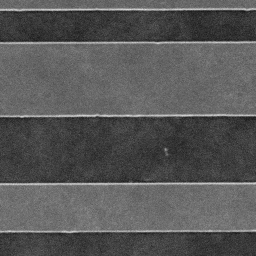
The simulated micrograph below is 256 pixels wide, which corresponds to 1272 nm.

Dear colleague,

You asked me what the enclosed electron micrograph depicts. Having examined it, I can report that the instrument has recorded one or a few lines or trenches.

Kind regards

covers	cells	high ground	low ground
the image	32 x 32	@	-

@@@@@@@@@@@@@@@@@@@@@@@@@@@@@@@@
--------------------------------
--------------------------------
--------------------------------
--------------------------------
@@@@@@@@@@@@@@@@@@@@@@@@@@@@@@@@
@@@@@@@@@@@@@@@@@@@@@@@@@@@@@@@@
@@@@@@@@@@@@@@@@@@@@@@@@@@@@@@@@
@@@@@@@@@@@@@@@@@@@@@@@@@@@@@@@@
@@@@@@@@@@@@@@@@@@@@@@@@@@@@@@@@
@@@@@@@@@@@@@@@@@@@@@@@@@@@@@@@@
@@@@@@@@@@@@@@@@@@@@@@@@@@@@@@@@
@@@@@@@@@@@@@@@@@@@@@@@@@@@@@@@@
@@@@@@@@@@@@@@@@@@@@@@@@@@@@@@@@
-@@@---@@@---@--@---------------
--------------------------------
--------------------------------
--------------------------------
--------------------------------
--------------------------------
--------------------------------
--------------------------------
--------------------------------
@@@@@@@@@@@@@@@@@@@@@@@@@@@@@@@@
@@@@@@@@@@@@@@@@@@@@@@@@@@@@@@@@
@@@@@@@@@@@@@@@@@@@@@@@@@@@@@@@@
@@@@@@@@@@@@@@@@@@@@@@@@@@@@@@@@
@@@@@@@@@@@@@@@@@@@@@@@@@@@@@@@@
@@@@@@@@@@@@@@@@@@@@@@@@@@@@@@@@
--------------------------------
--------------------------------
--------------------------------